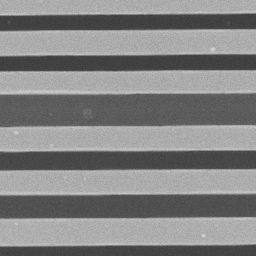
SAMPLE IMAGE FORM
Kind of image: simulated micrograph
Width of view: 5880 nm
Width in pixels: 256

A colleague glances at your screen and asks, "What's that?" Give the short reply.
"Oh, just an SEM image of lines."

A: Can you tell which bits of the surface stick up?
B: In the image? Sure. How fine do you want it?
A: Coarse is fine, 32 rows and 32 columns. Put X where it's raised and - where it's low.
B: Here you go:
XXXXXXXXXXXXXXXXXXXXXXXXXXXXXXXX
XXXXXXXXXXXXXXXXXXXXXXXXXXXXXXXX
--------------------------------
--------------------------------
XXXXXXXXXXXXXXXXXXXXXXXXXXXXXXXX
XXXXXXXXXXXXXXXXXXXXXXXXXXXXXXXX
XXXXXXXXXXXXXXXXXXXXXXXXXXXXXXXX
--------------------------------
--------------------------------
XXXXXXXXXXXXXXXXXXXXXXXXXXXXXXXX
XXXXXXXXXXXXXXXXXXXXXXXXXXXXXXXX
XXXXXXXXXXXXXXXXXXXXXXXXXXXXXXXX
--------------------------------
--------------------------------
--------------------------------
--------------------------------
XXXXXXXXXXXXXXXXXXXXXXXXXXXXXXXX
XXXXXXXXXXXXXXXXXXXXXXXXXXXXXXXX
XXXXXXXXXXXXXXXXXXXXXXXXXXXXXXXX
--------------------------------
--------------------------------
XXXXXXXXXXXXXXXXXXXXXXXXXXXXXXXX
XXXXXXXXXXXXXXXXXXXXXXXXXXXXXXXX
XXXXXXXXXXXXXXXXXXXXXXXXXXXXXXXX
--------------------------------
--------------------------------
--------------------------------
XXXXXXXXXXXXXXXXXXXXXXXXXXXXXXXX
XXXXXXXXXXXXXXXXXXXXXXXXXXXXXXXX
XXXXXXXXXXXXXXXXXXXXXXXXXXXXXXXX
XXXXXXXXXXXXXXXXXXXXXXXXXXXXXXX-
--------------------------------